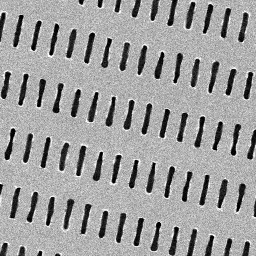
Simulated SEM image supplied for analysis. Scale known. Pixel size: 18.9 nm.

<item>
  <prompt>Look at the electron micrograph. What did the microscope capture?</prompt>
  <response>a regular array of holes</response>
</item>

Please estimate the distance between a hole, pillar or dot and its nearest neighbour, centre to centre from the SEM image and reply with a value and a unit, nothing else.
0.34 µm